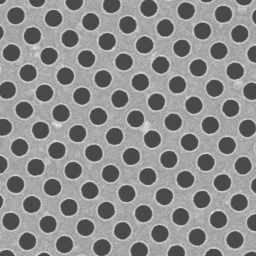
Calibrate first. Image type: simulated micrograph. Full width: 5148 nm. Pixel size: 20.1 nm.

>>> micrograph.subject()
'a regular array of holes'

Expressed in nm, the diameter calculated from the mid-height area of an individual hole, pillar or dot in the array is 353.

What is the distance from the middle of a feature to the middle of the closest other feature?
520 nanometers